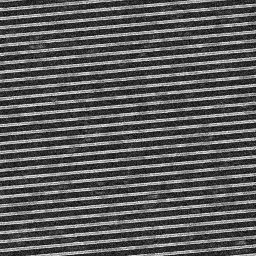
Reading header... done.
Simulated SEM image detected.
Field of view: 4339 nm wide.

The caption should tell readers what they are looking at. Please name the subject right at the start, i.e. parallel lines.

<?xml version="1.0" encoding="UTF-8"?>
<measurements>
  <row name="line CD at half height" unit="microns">0.0464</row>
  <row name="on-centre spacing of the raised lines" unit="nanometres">151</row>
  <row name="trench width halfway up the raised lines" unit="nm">103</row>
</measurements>